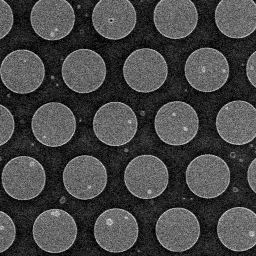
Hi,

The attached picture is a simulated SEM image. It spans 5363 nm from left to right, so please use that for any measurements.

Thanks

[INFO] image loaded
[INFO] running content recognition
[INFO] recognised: an array of small figures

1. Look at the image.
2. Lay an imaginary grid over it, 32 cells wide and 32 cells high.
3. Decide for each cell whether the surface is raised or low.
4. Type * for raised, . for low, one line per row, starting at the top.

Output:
*...*****...****....****...*****
*...*****...*****..******..*****
**..*****...*****..******..*****
*...*****...*****...****...*****
*....***.....***.....**.....***.
................................
..**.....***.....***....***.....
*****...*****...*****..*****...*
*****...*****..******..******..*
*****...*****...*****..*****...*
.****...*****...****....****....
..**......*.......*.............
................................
*....****....***....****....****
**..*****...*****...*****..*****
**..*****...*****..******..*****
**..*****...*****...*****..*****
*....****....***....****....***.
................................
..........*.......*......**.....
.****...*****...****....****...*
******..*****...*****..******..*
******..*****...*****..******..*
.****...*****...*****...****...*
.***.....***.....***.....**.....
................................
......**.....***.....***....****
*....****...*****...*****..*****
**..******..*****...*****..*****
**..******..*****...*****..*****
*....****...*****...****....****
......**......*.................